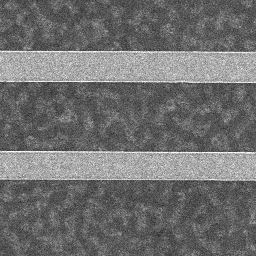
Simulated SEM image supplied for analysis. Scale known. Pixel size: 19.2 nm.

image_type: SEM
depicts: one or a few lines or trenches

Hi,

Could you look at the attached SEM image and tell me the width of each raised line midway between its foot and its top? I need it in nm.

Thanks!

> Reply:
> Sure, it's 549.